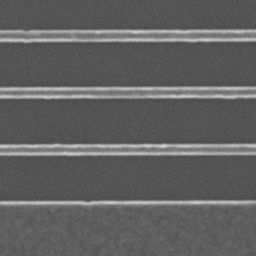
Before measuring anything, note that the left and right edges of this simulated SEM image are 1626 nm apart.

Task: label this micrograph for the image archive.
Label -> parallel lines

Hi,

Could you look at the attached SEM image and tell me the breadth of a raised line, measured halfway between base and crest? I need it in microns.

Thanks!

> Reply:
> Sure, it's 0.0659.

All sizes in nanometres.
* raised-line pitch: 361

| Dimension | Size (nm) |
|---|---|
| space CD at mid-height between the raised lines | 298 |